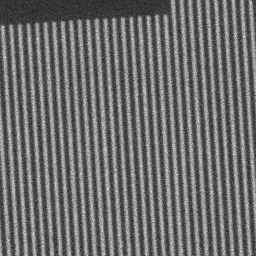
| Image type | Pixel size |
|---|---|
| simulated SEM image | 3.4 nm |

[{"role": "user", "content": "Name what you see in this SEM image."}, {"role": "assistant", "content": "parallel lines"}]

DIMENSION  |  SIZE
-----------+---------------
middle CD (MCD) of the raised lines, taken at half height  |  12.7 nm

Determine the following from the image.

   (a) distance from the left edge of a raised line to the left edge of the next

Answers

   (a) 29.2 nm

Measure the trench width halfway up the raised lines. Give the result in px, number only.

4.74